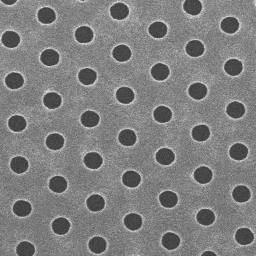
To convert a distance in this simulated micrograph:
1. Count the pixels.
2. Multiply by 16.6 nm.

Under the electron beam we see a regular array of holes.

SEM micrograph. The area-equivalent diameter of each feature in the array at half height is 302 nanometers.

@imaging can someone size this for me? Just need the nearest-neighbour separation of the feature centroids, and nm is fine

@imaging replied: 689